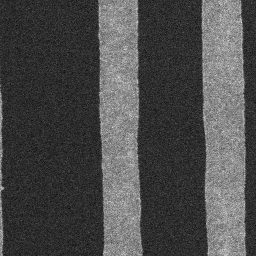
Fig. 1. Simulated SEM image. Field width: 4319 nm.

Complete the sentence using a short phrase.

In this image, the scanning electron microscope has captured one or a few lines or trenches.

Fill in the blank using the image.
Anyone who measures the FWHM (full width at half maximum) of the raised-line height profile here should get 643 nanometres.